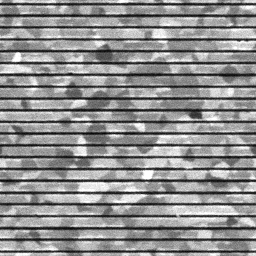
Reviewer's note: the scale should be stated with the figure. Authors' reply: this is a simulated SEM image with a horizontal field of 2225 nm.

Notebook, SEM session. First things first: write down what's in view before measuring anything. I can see parallel lines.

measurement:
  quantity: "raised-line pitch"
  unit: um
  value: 0.102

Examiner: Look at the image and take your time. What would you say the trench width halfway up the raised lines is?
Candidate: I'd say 30.4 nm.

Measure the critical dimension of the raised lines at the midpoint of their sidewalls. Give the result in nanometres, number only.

74.9